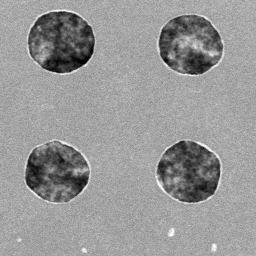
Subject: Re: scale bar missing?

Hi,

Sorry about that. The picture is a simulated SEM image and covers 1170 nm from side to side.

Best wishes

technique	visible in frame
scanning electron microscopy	holes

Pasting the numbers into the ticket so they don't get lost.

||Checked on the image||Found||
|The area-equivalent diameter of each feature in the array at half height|288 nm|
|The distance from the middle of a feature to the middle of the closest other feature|586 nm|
